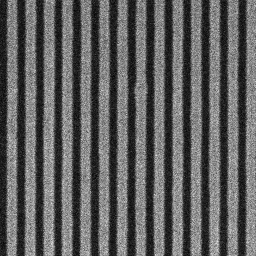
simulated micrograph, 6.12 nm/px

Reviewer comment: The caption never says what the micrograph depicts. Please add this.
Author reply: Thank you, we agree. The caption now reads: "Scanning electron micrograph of parallel lines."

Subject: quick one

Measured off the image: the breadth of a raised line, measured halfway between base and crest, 9.49 px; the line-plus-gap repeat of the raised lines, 113 nm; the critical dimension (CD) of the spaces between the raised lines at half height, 0.0528 microns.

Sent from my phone